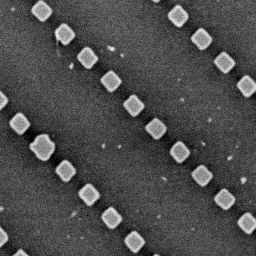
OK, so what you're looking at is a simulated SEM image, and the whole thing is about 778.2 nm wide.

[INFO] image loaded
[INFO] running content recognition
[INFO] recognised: a regular array of raised bodies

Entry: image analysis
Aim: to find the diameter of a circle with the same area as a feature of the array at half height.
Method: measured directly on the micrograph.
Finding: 56.3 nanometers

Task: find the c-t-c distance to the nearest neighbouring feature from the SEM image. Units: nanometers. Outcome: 99.6